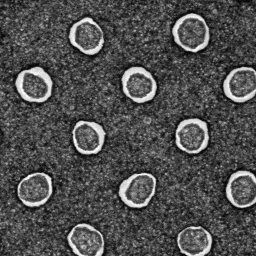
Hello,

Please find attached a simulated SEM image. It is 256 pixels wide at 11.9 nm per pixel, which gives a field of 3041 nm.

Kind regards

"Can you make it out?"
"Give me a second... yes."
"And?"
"a regular array of raised bodies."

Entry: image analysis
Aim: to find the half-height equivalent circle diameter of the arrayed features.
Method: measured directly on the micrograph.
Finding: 383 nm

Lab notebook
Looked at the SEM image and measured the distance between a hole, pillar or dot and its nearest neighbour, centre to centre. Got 72.9 pixels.